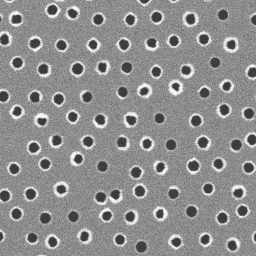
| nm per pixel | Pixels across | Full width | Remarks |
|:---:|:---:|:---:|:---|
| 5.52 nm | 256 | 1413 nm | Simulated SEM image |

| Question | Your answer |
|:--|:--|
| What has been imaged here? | a regular array of holes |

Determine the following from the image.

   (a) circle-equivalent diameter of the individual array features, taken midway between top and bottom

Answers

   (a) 0.0554 microns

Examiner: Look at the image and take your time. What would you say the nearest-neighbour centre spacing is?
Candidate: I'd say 0.132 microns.